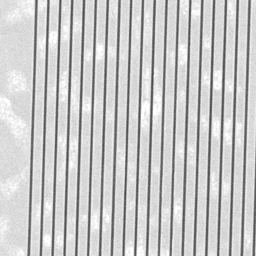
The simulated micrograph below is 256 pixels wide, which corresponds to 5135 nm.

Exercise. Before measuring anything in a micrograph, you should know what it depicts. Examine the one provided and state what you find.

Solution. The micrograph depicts parallel lines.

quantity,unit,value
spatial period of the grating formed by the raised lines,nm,237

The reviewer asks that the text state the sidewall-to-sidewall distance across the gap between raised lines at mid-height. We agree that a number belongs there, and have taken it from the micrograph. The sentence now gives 52.6 nm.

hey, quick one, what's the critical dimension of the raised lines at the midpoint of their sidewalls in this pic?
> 9.25 px